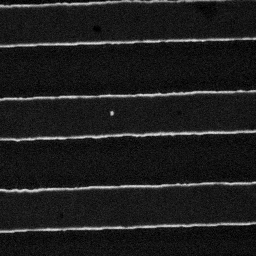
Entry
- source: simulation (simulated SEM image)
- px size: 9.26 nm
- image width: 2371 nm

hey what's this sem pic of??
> lines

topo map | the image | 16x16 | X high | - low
XXXXXXXXXXXXXXXX
XXXXXXXXXXXXXXXX
XXXXXXXXXXXX----
----------------
----------------
----------------
XXXXXXXXXXXXXXXX
XXXXXXXXXXXXXXXX
XXXXXXX---------
----------------
----------------
------------XXXX
XXXXXXXXXXXXXXXX
XXXXXXXXXXXXXXXX
----------------
----------------